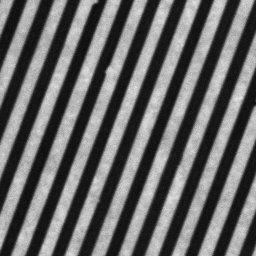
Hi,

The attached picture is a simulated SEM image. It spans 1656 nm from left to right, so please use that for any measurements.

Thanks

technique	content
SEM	parallel lines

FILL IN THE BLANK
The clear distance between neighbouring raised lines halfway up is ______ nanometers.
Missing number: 71.1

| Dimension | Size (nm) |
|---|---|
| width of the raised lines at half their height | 89.3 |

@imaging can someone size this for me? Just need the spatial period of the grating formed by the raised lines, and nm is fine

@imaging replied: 162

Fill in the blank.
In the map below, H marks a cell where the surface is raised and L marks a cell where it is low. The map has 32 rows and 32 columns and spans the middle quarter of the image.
HHLLHHHHLLLHHHHLLLHHHLLLHHHHLLLH
HLLLHHHHLLLHHHLLLHHHHLLLHHHHLLLH
HLLLHHHLLLHHHHLLLHHHHLLLHHHHLLLH
LLLHHHHLLLHHHHLLLHHHLLLHHHHLLLHH
LLLHHHHLLLHHHLLLHHHHLLLHHHHLLLHH
LLHHHHLLLHHHHLLLHHHHLLLHHHLLLHHH
LLHHHHLLLHHHHLLLHHHLLLHHHHLLLHHH
LLHHHHLLLHHHLLLHHHHLLLHHHHLLLHHH
LHHHHLLLHHHHLLLHHHLLLHHHHLLLHHHH
LHHHHLLLHHHLLLHHHHLLLHHHHLLLHHHH
LHHHLLLHHHHLLLHHHHLLLHHHHLLHHHHL
HHHHLLLHHHHLLLHHHLLLHHHHLLLHHHHL
HHHHLLLHHHLLLHHHHLLLHHHHLLHHHHLL
HHHLLLHHHHLLLHHHHLLLHHHLLLHHHHLL
HHHLLLHHHHLLLHHHLLLHHHHLLLHHHHLL
HHHLLLHHHLLLHHHHLLLHHHHLLHHHHLLL
HHLLLHHHHLLLHHHLLLHHHHLLLHHHHLLL
HHLLLHHHLLLHHHHLLLHHHHLLLHHHHLLH
HHLLHHHHLLLHHHHLLLHHHHLLHHHHLLLH
HLLLHHHHLLLHHHLLLHHHHLLLHHHHLLLH
HLLLHHHLLLHHHHLLLHHHHLLHHHHLLLHH
HLLHHHHLLLHHHHLLLHHHLLLHHHHLLLHH
LLLHHHHLLLHHHLLLHHHHLLLHHHHLLLHH
LLLHHHLLLHHHHLLLHHHHLLLHHHLLLHHH
LLHHHHLLLHHHLLLHHHHLLLHHHHLLLHHH
LLHHHLLLHHHHLLLHHHHLLLHHHHLLLHHH
LHHHHLLLHHHHLLLHHHHLLHHHHLLLHHHH
LHHHHLLLHHHLLLHHHHLLLHHHHLLLHHHL
LHHHLLLHHHHLLLHHHHLLLHHHLLLHHHHL
HHHHLLLHHHHLLHHHHLLLHHHHLLLHHHHL
HHHHLLLHHHLLLHHHHLLLHHHHLLLHHHLL
HHHLLLHHHHLLLHHHHLLLHHHLLLHHHHLL